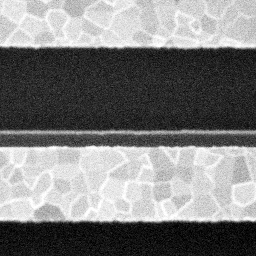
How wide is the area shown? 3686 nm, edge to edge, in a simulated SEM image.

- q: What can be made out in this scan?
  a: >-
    lines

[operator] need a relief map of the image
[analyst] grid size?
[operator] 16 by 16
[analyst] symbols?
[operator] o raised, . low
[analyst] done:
oooooooooooooooo
oooooooooooooooo
oooooooooooooooo
................
................
................
................
................
................
oooooooooooooooo
oooooooooooooooo
oooooooooooooooo
oooooooooooooooo
oooooooooooooooo
................
................